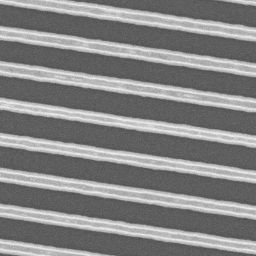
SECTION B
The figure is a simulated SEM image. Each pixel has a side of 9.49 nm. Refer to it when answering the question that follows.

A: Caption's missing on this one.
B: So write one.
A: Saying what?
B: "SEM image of parallel lines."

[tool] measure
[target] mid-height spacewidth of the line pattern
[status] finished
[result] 245 nanometers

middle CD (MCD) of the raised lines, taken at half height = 90.4 nm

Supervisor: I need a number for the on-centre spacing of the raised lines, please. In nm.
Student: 334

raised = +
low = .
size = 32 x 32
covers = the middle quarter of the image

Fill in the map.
................................
................................
++..............................
+++++++++.......................
++++++++++++++++................
.......++++++++++++++++.........
..............+++++++++++++++...
.....................+++++++++++
..........................++++++
................................
................................
+...............................
++++++++........................
.+++++++++++++..................
........+++++++++++++...........
...............+++++++++++++....
.......................+++++++++
.............................+++
................................
................................
+++.............................
++++++++........................
..++++++++++++++................
........+++++++++++++++.........
................++++++++++++++..
.....................+++++++++++
..............................++
................................
................................
+++++...........................
+++++++++++.....................
...++++++++++++++...............